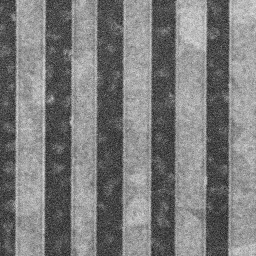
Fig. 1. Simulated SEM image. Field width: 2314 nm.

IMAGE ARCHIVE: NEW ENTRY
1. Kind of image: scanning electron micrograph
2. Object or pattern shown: parallel lines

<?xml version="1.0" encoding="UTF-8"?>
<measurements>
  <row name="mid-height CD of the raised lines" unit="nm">244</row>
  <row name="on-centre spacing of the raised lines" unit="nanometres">483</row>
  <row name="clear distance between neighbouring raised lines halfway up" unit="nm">236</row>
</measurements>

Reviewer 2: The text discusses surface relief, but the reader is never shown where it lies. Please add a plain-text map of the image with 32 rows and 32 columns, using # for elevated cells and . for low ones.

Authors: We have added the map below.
..###....###....###...####...###
..###....###....###...####...###
..###....###....###...####...###
..###....###....###...####...###
..###....###....###...####...###
..###....###....###...####...###
..###....###....###...####...###
..###....###....###...####...###
..###....###....###...####...###
..###....###....###...####...###
..###....###....###...####...###
..###....###....###...####...###
..###....###....###...####...###
..###....###....###...####...###
..###....###....###...####...###
..###....###....###...####...###
..###....###....###...####...###
..###....###....###...####...###
..###....###....###...####...###
..###....###....###...####...###
..###....###....###...####...###
..###....###....###...####...###
..###....###....###...####...###
..###....###....###...####...###
..###....###....###...####...###
..###....###....###...####...###
..###....###....###...####...###
..###....###....###...####...###
..###....###....###...####...###
..###....###....###...####...###
..###....###...####...####...###
..###....###...####...####...###